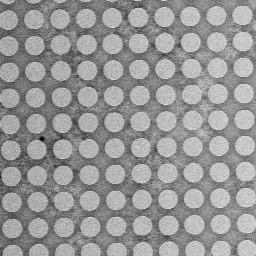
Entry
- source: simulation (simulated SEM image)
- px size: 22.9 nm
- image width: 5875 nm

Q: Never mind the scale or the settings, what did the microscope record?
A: an array of small figures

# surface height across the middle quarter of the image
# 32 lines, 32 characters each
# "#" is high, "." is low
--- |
#...####..####..#####..####...##
##.#####..#####.#####..#####..##
#...####..####...####..####...##
#...###....###....##....##......
................................
.........................#.....#
#...####...###...####..####...##
##..####..#####..####..#####..##
##..####..#####..####..#####..##
#...####...###...####...###...##
.....##.........................
................................
.....##....###....##....###...##
#...####..#####..####..#####..##
##..####..#####..####..#####..##
##..####..#####..####...####..##
#....###...###....##.....#......
................................
...............................#
#...####...###...####...####..##
##..####..#####..#####.#####..##
##..####..#####..#####.#####..##
##..####...####..####...###....#
#...............................
................................
............##....###...###....#
##..####...####..####...####..##
##..#####..####..#####..####..##
##..#####..####..####...####..##
#....###...###....##.....##.....
................................
................................